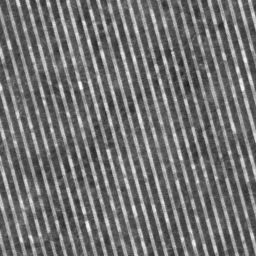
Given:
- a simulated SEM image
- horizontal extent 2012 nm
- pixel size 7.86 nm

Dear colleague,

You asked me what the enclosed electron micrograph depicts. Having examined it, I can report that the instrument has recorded parallel lines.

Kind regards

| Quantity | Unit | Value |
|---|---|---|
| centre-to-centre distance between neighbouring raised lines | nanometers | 76.6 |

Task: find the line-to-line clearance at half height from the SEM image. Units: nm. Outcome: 57.8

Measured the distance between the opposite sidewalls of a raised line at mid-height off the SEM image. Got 18.1 nm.